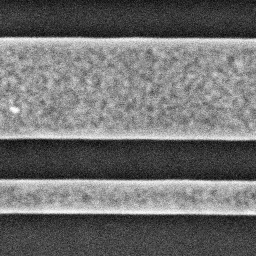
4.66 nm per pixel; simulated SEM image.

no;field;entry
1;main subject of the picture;wiring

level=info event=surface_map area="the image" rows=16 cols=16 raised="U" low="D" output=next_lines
DDDDDDDDDDDDDDDD
DDDDDDDDDDDDDDDD
UUUUUUUUUUUUUUUU
UUUUUUUUUUUUUUUU
UUUUUUUUUUUUUUUU
UUUUUUUUUUUUUUUU
UUUUUUUUUUUUUUUU
UUUUUUUUUUUUUUUU
UUUUUUUUUUUUUUUU
DDDDDDDDDDDDDDDD
DDDDDDDDDDDDDDDD
UUUUUUUUUUUUUUUU
UUUUUUUUUUUUUUUU
DDDDDDDDDDDDDDDD
DDDDDDDDDDDDDDDD
DDDDDDDDDDDDDDDD